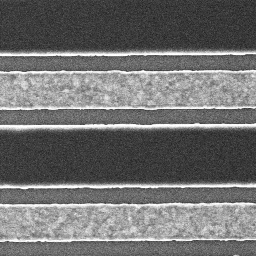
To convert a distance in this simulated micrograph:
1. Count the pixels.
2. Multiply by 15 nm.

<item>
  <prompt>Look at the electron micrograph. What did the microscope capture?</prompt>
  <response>lines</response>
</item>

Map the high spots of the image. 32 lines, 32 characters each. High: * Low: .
********************************
********************************
********************************
********************************
********************************
********************************
********************************
................................
................................
********************************
********************************
********************************
********************************
******************************..
................................
................................
********************************
********************************
********************************
********************************
********************************
********************************
********************************
................................
................................
................................
********************************
********************************
********************************
********************************
................................
................................